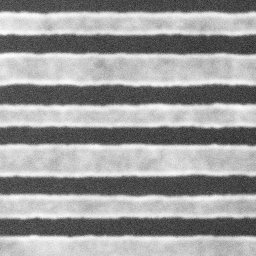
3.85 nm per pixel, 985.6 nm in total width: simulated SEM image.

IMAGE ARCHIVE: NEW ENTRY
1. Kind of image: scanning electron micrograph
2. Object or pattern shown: lines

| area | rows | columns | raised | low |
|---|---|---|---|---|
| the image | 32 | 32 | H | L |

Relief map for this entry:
LLLLLLLLLLLLLLLLLLLLLLLLLLLLLLLL
LLLLLLLLLLLLLLLLLLLLLLLLLLLLLLLL
HHHHHHHHHHHHHHHHHHHHHHHHHHHHHHHH
HHHHHHHHHHHHHHHHHHHHHHHHHHHHHHHH
LLLLLLLLLLLLLLLLLLLLLLLLLLLLLLLL
LLLLLLLLLLLLLLLLLLLLLLLLLLLLLLLL
LLLLLLLLLLLLLLLLLLLLLLLLLLLLLLLL
HHHHHHHHHHHHHHHHHHHHHHHHHHHHHHHH
HHHHHHHHHHHHHHHHHHHHHHHHHHHHHHHH
HHHHHHHHHHHHHHHHHHHHHHHHHHHHHHHH
HLLLLLLLLHHHLLLLHHHHHHHHLLLLLLLH
LLLLLLLLLLLLLLLLLLLLLLLLLLLLLLLL
LLLLLLLLLLLLLLLLLLLLLLLLLLLLLLLL
HHHHHHHHHHHHHHHHHHHHHHHHHHHHHHHH
HHHHHHHHHHHHHHHHHHHHHHHHHHHHHHHH
HHHHHHHHHHHHHHHHHHHHHHHHHHHHHHHH
LLLLLLLLLLLLLLLLLLLLLLLLLLLLLLLL
LLLLLLLLLLLLLLLLLLLLLLLLLLLLLLLL
HHHHHHHHHHHHHHHHHHHHHHHHHHHHHHHH
HHHHHHHHHHHHHHHHHHHHHHHHHHHHHHHH
HHHHHHHHHHHHHHHHHHHHHHHHHHHHHHHH
HHHHHHHHHHHHHHHHHHHHHHHHHHHHHHHH
LLLLLLLLLLLLLLLLLLLLLLLLLLLLLLLL
LLLLLLLLLLLLLLLLLLLLLLLLLLLLLLLL
LLLLLLLLLLLLLLLLLLLLLLLLLLLLLLLL
HHHHHHHHHHHHHHHHHHHHHHHHHHHHHHHH
HHHHHHHHHHHHHHHHHHHHHHHHHHHHHHHH
LLLLLLLLLLLLLLLLLLLLLLLLLLLLLLLL
LLLLLLLLLLLLLLLLLLLLLLLLLLLLLLLL
LLLLLLLLLLLLLLLLLLLLLLLLLLLLLLLL
HHHHHHHHHHHHHHHHHHHHHHHHHHHHHHHH
HHHHHHHHHHHHHHHHHHHHHHHHHHHHHHHH